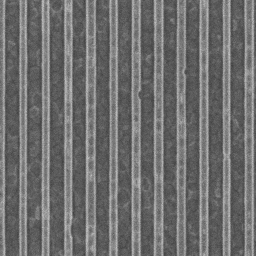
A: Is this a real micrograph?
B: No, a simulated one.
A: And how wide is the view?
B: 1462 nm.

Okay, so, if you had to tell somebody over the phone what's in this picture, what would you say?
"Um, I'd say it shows parallel lines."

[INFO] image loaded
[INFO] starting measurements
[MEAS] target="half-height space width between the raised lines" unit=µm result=0.0872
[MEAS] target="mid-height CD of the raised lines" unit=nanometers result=43.6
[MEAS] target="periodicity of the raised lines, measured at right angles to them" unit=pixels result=22.6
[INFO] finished